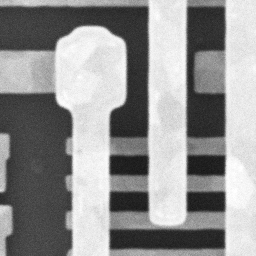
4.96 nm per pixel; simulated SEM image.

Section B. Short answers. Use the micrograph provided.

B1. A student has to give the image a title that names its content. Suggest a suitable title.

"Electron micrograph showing wiring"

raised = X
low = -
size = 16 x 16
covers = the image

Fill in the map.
---------XXX--XX
---------XXX--XX
----XXXX-XXX--XX
---XXXXX-XXX--XX
---XXXXX-XXX--XX
----XXXX-XXX--XX
----XXXX-XXX--XX
-----XX--XXX--XX
-----XX--XXX--XX
-----XX--XXX--XX
-----XX--XXX--XX
-----XX--XXX--XX
-----XX--XXX--XX
-----XX--XXX--XX
-----XX-------XX
-----XX-------XX